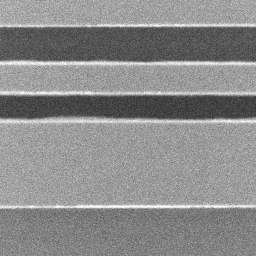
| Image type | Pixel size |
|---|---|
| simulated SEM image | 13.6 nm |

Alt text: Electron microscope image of lines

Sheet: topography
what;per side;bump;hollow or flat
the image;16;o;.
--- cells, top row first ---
oooooooooooooooo
oooooooooooooooo
................
................
oooooooooooooooo
oooooooooooooooo
................
................
oooooooooooooooo
oooooooooooooooo
oooooooooooooooo
oooooooooooooooo
oooooooooooooooo
................
................
................